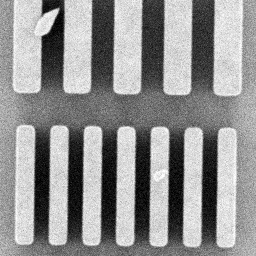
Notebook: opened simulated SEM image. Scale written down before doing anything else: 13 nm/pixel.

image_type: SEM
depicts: groups of lines, slits or small figures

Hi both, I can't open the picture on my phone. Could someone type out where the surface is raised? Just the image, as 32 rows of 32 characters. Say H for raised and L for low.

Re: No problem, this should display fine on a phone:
LLHHHLLLHHHLLLHHHHLLLHHHLLLHHHLL
LLHHHLHLHHHLLLHHHHLLLHHHLLLHHHLL
LLHHHHHLHHHLLLHHHHLLLHHHLLLHHHLL
LLHHHHLLHHHLLLHHHHLLLHHHLLLHHHLL
LLHHHLLLHHHLLLHHHHLLLHHHLLLHHHLL
LLHHHLLLHHHLLLHHHHLLLHHHLLLHHHLL
LLHHHLLLHHHLLLHHHHLLLHHHLLLHHHLL
LLHHHLLLHHHLLLHHHHLLLHHHLLLHHHLL
LLHHHLLLHHHLLLHHHHLLLHHHLLLHHHLL
LLHHHLLLHHHLLLHHHHLLLHHHLLLHHHLL
LLHHHLLLHHHLLLHHHHLLLHHHLLLHHHLL
LLHHLLLLHHHLLLLHHLLLLHHHLLLHHHLL
LLLLLLLLLLLLLLLLLLLLLLLLLLLLLLLL
LLLLLLLLLLLLLLLLLLLLLLLLLLLLLLLL
LLLLLLLLLLLLLLLLLLLLLLLLLLLLLLLL
LLLLLLLLLLLLLLLLLLLLLLLLLLLLLLLL
LLHHLLHHLLLHHLLHHLLHHLLHHLLHHLLL
LLHHLLHHLLHHHLLHHLLHHLLHHLLHHLLL
LLHHLLHHLLHHHLLHHLLHHLLHHLLHHLLL
LLHHLLHHLLHHHLLHHLLHHLLHHLLHHLLL
LLHHLLHHLLHHHLLHHLLHHLLHHLLHHLLL
LLHHLLHHLLHHHLLHHLLHHLLHHLLHHLLL
LLHHLLHHLLHHHLLHHLLHHLLHHLLHHLLL
LLHHLLHHLLHHHLLHHLLHHLLHHLLHHLLL
LLHHLLHHLLHHHLLHHLLHHLLHHLLHHLLL
LLHHLLHHLLHHHLLHHLLHHLLHHLLHHLLL
LLHHLLHHLLHHHLLHHLLHHLLHHLLHHLLL
LLHHLLHHLLHHHLLHHLLHHLLHHLLHHLLL
LLHHLLHHLLHHHLLHHLLHHLLHHLLHHLLL
LLHHLLHHLLHHHLLHHLLHHLLHHLLHHLLL
LLLLLLLHLLLHLLLHLLLHHLLHHLLHHLLL
LLLLLLLLLLLLLLLLLLLLLLLLLLLLLLLL